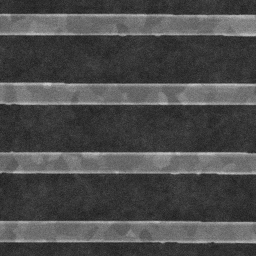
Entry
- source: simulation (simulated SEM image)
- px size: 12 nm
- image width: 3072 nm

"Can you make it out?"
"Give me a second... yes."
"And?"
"lines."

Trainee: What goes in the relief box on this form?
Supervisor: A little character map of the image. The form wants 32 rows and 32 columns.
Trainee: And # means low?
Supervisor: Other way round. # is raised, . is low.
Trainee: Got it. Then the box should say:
................................
................................
################################
################################
................................
................................
................................
................................
................................
................................
................................
################################
################################
................................
................................
................................
................................
................................
................................
################################
################################
.....###########################
................................
................................
................................
................................
................................
................................
################################
################################
................................
................................